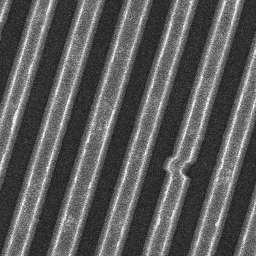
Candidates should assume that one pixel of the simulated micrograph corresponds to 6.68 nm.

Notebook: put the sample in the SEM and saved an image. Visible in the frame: parallel lines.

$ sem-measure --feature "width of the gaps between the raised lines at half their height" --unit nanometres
163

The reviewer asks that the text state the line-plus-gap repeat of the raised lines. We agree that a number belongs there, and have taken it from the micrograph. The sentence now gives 299 nm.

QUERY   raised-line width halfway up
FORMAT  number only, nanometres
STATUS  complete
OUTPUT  131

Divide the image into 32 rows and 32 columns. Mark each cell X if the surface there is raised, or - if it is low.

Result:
X---XXX---XXX---XXX---XX----XX--
X---XX----XX---XXX---XXX---XXX--
----XX---XXX---XXX---XXX---XXX--
---XXX---XXX---XXX---XX----XX---
---XX----XX----XX----XX---XXX---
---XX---XXX---XXX---XXX---XXX---
--XXX---XXX---XXX---XX----XX----
--XXX---XXX---XXX---XX---XXX---X
--XX----XX---XXX---XXX---XXX---X
--XX---XXX---XXX---XXX---XX----X
-XXX---XXX---XXX---XX----XX---XX
-XX----XX---XXX---XXX---XXX---XX
-XX---XXX---XXX---XXX---XXX---XX
XXX---XXX---XXX---XX----XX---XXX
XX----XX---XXX---XXX---XXX---XXX
XX---XXX---XXX---XXX---XXX---XX-
XX---XXX---XXX---XX----XX---XXX-
X----XX----XX----XX---XXX---XXX-
X----XX---XXX---XXX---XXX---XXX-
X---XXX---XXX---XXX---XX----XX--
X---XXX---XXX---XX---XXX---XXX--
----XX---XXX---XXX---XX----XXX--
---XXX---XXX---XXX---XX----XX---
---XXX---XXX---XX----XX---XXX---
---XX---XXX---XXX---XXX---XXX---
--XXX---XXX---XXX---XX----XX----
--XXX---XXX---XX----XX---XXX---X
--XX----XX----XX---XXX---XXX---X
--XX---XXX---XXX---XXX---XXX---X
-XXX---XXX---XX----XX----XX---XX
-XXX---XXX---XX---XXX---XXX---XX
-XX---XXX---XXX---XXX---XXX---XX